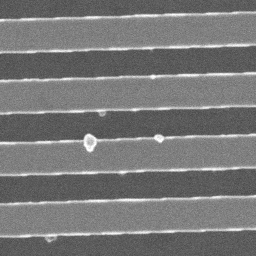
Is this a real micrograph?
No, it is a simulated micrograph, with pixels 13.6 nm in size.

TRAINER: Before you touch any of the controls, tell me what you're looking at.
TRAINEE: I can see lines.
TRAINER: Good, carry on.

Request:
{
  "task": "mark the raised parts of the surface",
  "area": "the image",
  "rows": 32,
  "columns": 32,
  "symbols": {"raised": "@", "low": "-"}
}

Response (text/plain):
--------------------------------
--------------------------------
@@@@@@@@@@@@@@@@@@@@@@@@@@@@@@@@
@@@@@@@@@@@@@@@@@@@@@@@@@@@@@@@@
@@@@@@@@@@@@@@@@@@@@@@@@@@@@@@@@
@@@@@@@@@@@@@@@@@@@@@@@@@@@@@@@@
@@@@@---------------------------
--------------------------------
--------------------------------
------------------@@@@@@@@@@@@@@
@@@@@@@@@@@@@@@@@@@@@@@@@@@@@@@@
@@@@@@@@@@@@@@@@@@@@@@@@@@@@@@@@
@@@@@@@@@@@@@@@@@@@@@@@@@@@@@@@@
@@@@@@@@@@@@@@@@@@@@@@@@@@@-----
--------------------------------
--------------------------------
--------------------------------
----------@@@@@@@@@@@@@@@@@@@@@@
@@@@@@@@@@@@@@@@@@@@@@@@@@@@@@@@
@@@@@@@@@@@@@@@@@@@@@@@@@@@@@@@@
@@@@@@@@@@@@@@@@@@@@@@@@@@@@@@@@
@@@@@@@@@@@@@@@@----------------
--------------------------------
--------------------------------
-------------------------------@
-@@@@@@@@@@@@@@@@@@@@@@@@@@@@@@@
@@@@@@@@@@@@@@@@@@@@@@@@@@@@@@@@
@@@@@@@@@@@@@@@@@@@@@@@@@@@@@@@@
@@@@@@@@@@@@@@@@@@@@@@@@@@@@@@@@
@@@@----------------------------
--------------------------------
--------------------------------